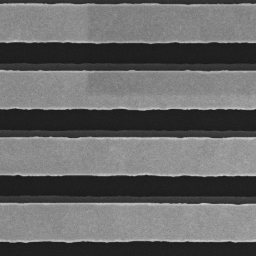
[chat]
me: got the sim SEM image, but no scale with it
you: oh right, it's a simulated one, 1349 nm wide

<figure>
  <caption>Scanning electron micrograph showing lines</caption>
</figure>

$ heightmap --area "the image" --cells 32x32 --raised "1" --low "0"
11111111111100111111000001010111
11111111111111111111111111111111
11111111111111111111111111111111
11111111111111111111111111111111
11111111111111111111111111111111
00000000000000000000000000000000
00000000000000000000000000000000
00000000000000000000000000000000
00000000000000000000000000000000
11111111111111111111111111111111
11111111111111111111111111111111
11111111111111111111111111111111
11111111111111111111111111111111
11111111111111111111111111111111
00000000000000000000000000000000
00000000000000000000000000000000
00000000000000000000000000000000
11111111111111111111111111111111
11111111111111111111111111111111
11111111111111111111111111111111
11111111111111111111111111111111
11111111111111111111111111111111
00000000000000000000000000000000
00000000000000000000000000000000
00000000000000000000000000000000
11111111111111111111111101100000
11111111111111111111111111111111
11111111111111111111111111111111
11111111111111111111111111111111
11111111111111111111111111111111
00000000000000000000000000000000
00000000000000000000000000000000